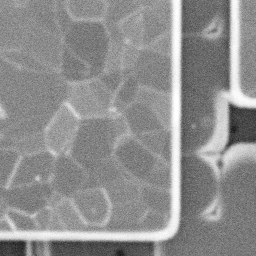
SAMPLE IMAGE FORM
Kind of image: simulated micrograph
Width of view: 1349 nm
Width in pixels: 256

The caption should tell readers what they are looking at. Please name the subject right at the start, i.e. wiring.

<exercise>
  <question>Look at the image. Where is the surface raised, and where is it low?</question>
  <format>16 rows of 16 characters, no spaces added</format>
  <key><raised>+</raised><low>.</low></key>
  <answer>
+++++++++++....+
+++++++++++....+
+++++++++++....+
+++++++++++....+
+++++++++++....+
+++++++++++....+
+++++++++++.....
+++++++++++.....
+++++++++++.....
+++++++++++.....
+++++++++++.....
+++++++++++.....
+++++++++++.....
+++++++++++.....
+++++++++++.....
................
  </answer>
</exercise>